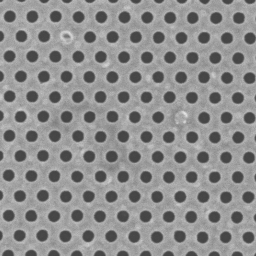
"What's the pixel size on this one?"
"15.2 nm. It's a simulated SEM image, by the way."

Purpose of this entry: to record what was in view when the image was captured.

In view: a regular array of holes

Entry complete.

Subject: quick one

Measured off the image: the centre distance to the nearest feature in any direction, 343 nm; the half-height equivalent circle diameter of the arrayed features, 187 nm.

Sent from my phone